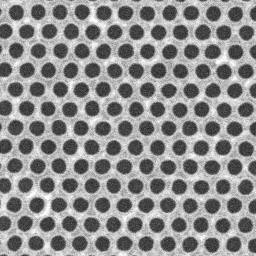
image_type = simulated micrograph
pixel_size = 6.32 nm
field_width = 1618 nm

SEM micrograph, a regular array of holes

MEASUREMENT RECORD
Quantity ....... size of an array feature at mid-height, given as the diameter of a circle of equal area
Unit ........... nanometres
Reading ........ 101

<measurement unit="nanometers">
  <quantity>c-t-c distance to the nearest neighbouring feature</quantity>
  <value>136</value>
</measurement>